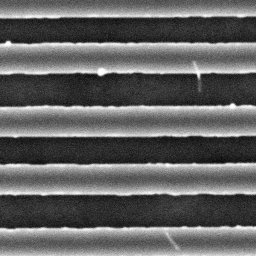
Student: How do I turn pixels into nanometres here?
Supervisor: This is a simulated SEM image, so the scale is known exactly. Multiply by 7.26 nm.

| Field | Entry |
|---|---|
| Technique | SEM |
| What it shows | lines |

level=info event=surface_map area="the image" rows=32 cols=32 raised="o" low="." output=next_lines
oooooooooooooooooooooooooooooooo
oooooooooooooooooooooooooooooooo
................................
................................
................................
oo...ooooooooooooooooooooooooooo
oooooooooooooooooooooooooooooooo
oooooooooooooooooooooooooooooooo
oooooooooooooooooooooooooooooooo
................................
................................
................................
................................
oooooooooooooooooooooooooooooooo
oooooooooooooooooooooooooooooooo
oooooooooooooooooooooooooooooooo
oooooooooooooooooooooooooooooooo
................................
................................
................................
..................ooo...o...oooo
oooooooooooooooooooooooooooooooo
oooooooooooooooooooooooooooooooo
oooooooooooooooooooooooooooooooo
................................
................................
................................
................................
......................oooo.ooooo
oooooooooooooooooooooooooooooooo
oooooooooooooooooooooooooooooooo
oooooooooooooooooooooooooooooooo